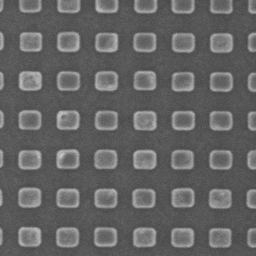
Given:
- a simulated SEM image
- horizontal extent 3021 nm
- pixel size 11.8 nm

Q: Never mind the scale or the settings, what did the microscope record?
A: a regular array of raised bodies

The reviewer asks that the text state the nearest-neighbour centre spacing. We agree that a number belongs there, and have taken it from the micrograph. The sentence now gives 447 nanometers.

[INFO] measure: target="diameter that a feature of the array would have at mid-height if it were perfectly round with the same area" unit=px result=21.9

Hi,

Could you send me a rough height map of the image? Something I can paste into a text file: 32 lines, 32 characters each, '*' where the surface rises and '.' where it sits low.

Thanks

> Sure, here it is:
...**..***..***..***..**..***..*
........*.............**...**..*
................................
................................
...**..***..***..**...**...**..*
...**..***..***..**...**..***..*
................................
................................
................................
..***..***..***..**...**..***..*
..***..***..***..**...**..***..*
................................
................................
................................
..***..***..***..**...**..***..*
..***..***..***..**...**..***..*
................................
................................
................................
..***..***..**...**...**..***..*
..***..***..**...**...**..***..*
................................
................................
................................
..***..***..***..**...**..***..*
...**..***..***..**...**..***..*
................................
................................
................................
..***..***..**...**..***..***..*
...**..***..**...**...**..***..*
................................